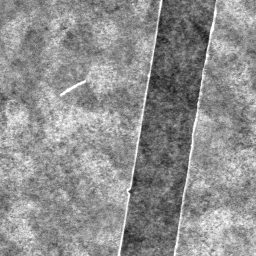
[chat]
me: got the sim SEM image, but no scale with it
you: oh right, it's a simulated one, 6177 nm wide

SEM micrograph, one or a few lines or trenches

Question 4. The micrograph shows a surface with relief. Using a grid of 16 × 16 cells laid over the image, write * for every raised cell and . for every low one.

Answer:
**********...***
**********...***
**********...***
**********...***
*********....***
*********....***
*********...****
*********...****
*********...****
*********...****
********....****
********....****
********...*****
********...*****
********...*****
********...*****